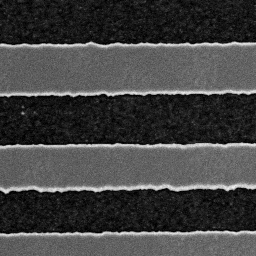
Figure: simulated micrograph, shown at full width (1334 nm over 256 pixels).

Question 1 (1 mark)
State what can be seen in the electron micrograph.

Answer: lines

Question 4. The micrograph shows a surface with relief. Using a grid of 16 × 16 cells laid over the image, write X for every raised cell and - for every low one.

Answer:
----------------
----------------
----------------
XXXXXXXXXXXXXXXX
XXXXXXXXXXXXXXXX
XXXXXXXXXXXXXXXX
----------------
----------------
----------------
XXXXXXXXXXXXXXXX
XXXXXXXXXXXXXXXX
XXXXXXXXXXXXXXXX
----------------
----------------
------------XXXX
XXXXXXXXXXXXXXXX